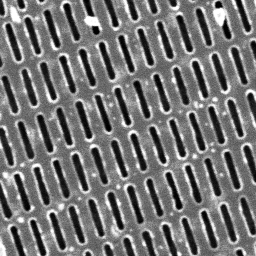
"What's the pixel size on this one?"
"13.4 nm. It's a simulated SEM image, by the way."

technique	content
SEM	a regular array of holes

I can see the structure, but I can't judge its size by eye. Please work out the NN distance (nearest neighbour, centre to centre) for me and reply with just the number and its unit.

274 nanometers